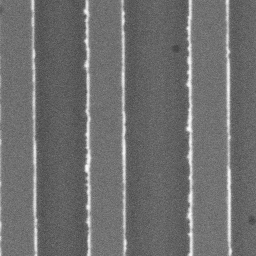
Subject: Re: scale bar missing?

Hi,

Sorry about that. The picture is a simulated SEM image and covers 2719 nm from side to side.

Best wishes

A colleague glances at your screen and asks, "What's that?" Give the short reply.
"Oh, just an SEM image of lines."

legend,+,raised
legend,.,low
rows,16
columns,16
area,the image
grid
++...+++....++..
++...+++....++..
++...+++....++..
++...+++....++..
++...+++....++..
++...+++....++..
++...+++....++..
++...+++....++..
++...+++....++..
++...+++....++..
++....++....++..
++....++....++..
++....++....++..
++....++....++..
++....++....++..
++....++....++..